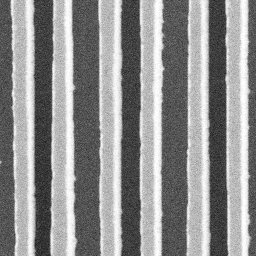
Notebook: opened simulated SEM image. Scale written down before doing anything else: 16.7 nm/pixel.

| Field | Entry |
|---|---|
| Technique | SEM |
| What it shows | lines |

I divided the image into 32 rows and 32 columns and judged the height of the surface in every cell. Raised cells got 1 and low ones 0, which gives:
01110001100011100011000011001110
01110001100011100011000011001110
00110001100011100011000011001110
00110001100001100011000011001110
00110001100001100011000011001110
00110001100001100011000011001110
00110001100001100011000011001110
00110001100001100011000011001110
00110001100001100011000011001110
00110001100001100011000011001110
00110001100001100011000011001110
00110001100001100011000011001110
00110001100001100011000011001110
00110001100001100011000011001110
00110001100001100011000011001110
00110001100001100011000011001110
00110001100001100011000011001110
00110001100001100011000011001110
00110001100001100011000111001110
00110001100001100011000111001110
00110001100001100011000111001110
00110001100001100011000111001110
00110001100001100011000111001110
00110001100001100011000011001110
00110001100001100011000011000110
00110001100001100011000111000110
00110001100001100011000111000110
00110001100001100011000111000110
00110011100001100011000111000110
00110011100001100011000111000110
00110011100001100011000111000110
00110011100001100011000111000110